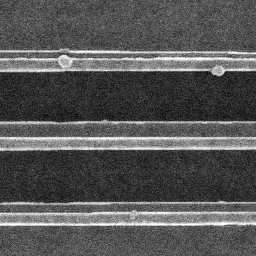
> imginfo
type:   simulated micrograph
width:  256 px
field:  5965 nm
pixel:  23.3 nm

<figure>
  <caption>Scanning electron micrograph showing lines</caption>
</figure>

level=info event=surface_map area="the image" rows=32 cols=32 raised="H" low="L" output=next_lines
LLLLLLLLLLLLLLLLLLLLLLLLLLLLLLLL
LLLLLLLLLLLLLLLLLLLLLLLLLLLLLLLL
LLLLLLLLLLLLLLLLLLLLLLLLLLLLLLLL
LLLLLLLLLLLLLLLLLLLLLLLLLLLLLLLL
LLLLLLLLLLLLLLLLLLLLLLLLLLLLLLLL
LLLLLLLLLLLLLLLLLLLLLLLLLLLLLLLL
HHHHHHHHHLLLLLLLLLLLLLLLHLLLLLLL
HHHHHHHHHHHHHHHHHHHHHHHHHHHHHHHH
HHHHHHHHHHHHHHHHHHHHHHHHHHHHHHHH
LLLLLLLLLLLLLLLLLLLLLLLLLLLLLLLL
LLLLLLLLLLLLLLLLLLLLLLLLLLLLLLLL
LLLLLLLLLLLLLLLLLLLLLLLLLLLLLLLL
LLLLLLLLLLLLLLLLLLLLLLLLLLLLLLLL
LLLLLLLLLLLLLLLLLLLLLLLLLLLLLLLL
LLLLLLLLLLLLLLLLLLLLLLLLLLLLLLLL
HHHHHHHHHHHHHHHHHHHHHHHHHHHHHHHH
HHHHHHHHHHHHHHHHHHHHHHHHHHHHHHHH
HHHHHHHHHHHHHHHHHHHHHHHHHHHHHHHH
HHHHHHHHHHHHHHHHHHHHHHHHHHHHHHHH
LLLLLLLLLLLLLLLLLLLLLLLLLLLLLLLL
LLLLLLLLLLLLLLLLLLLLLLLLLLLLLLLL
LLLLLLLLLLLLLLLLLLLLLLLLLLLLLLLL
LLLLLLLLLLLLLLLLLLLLLLLLLLLLLLLL
LLLLLLLLLLLLLLLLLLLLLLLLLLLLLLLL
LLLLLLLLLLLLLLLLLLLLLLLLLLLLLLLL
HHHHHHHHHHHHHHHHHHHHHHHHHHHHHHHH
HHHHHHHHHHHHHHHHHHHHHHHHHHHHHHHH
HHHHHHHHHHHHHHHHHHHHHHHHHHHHHHHH
LLLLLLLLLLLLLLLLLLLLLLLLLLLLLLLL
LLLLLLLLLLLLLLLLLLLLLLLLLLLLLLLL
LLLLLLLLLLLLLLLLLLLLLLLLLLLLLLLL
LLLLLLLLLLLLLLLLLLLLLLLLLLLLLLLL